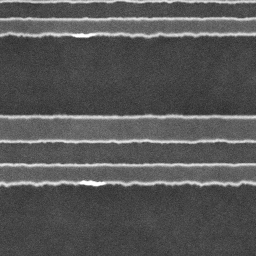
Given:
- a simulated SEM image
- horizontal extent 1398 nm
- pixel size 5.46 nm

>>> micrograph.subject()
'lines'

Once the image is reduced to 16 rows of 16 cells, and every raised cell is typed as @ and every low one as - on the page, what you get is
@@@@@@@@@@@@@@@@
@@@@@@@@@@@@@@@@
----------------
----------------
----------------
----------------
----------------
@@@@@@@@@@@@@@@@
@@@@@@@@@@@@@@@@
@@@@@@@@@@@@@@@@
@@@@@@@@@@@@@@@@
-----@----------
----------------
----------------
----------------
----------------